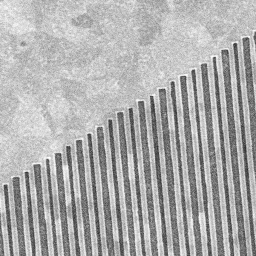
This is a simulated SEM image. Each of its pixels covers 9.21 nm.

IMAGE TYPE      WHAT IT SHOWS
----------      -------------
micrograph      parallel lines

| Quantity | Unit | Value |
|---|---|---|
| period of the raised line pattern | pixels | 10.9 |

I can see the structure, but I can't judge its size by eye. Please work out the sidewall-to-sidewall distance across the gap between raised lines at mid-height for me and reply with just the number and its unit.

50.4 nm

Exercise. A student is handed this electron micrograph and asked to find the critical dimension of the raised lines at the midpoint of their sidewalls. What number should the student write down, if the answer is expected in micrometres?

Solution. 0.0413